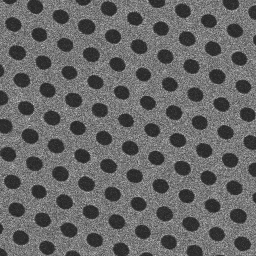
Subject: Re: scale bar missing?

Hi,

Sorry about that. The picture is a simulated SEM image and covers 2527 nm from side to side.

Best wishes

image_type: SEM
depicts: a regular array of holes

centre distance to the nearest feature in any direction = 274 nanometers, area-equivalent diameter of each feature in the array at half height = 0.153 micrometres